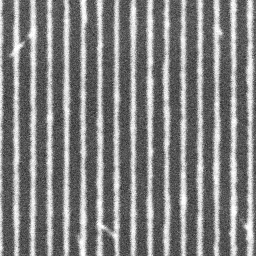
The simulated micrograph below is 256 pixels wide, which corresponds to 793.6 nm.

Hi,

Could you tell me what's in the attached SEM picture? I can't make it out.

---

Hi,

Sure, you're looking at parallel lines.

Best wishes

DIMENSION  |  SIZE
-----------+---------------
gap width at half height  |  0.0423 µm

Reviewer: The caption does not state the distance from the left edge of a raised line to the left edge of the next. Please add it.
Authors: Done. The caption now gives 51.7 nm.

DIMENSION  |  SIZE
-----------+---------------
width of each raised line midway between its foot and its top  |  10.1 nanometres